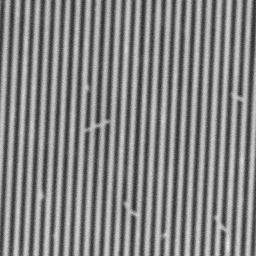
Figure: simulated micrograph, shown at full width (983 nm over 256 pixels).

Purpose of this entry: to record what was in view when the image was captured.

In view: parallel lines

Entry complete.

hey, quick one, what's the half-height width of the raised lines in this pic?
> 17.8 nm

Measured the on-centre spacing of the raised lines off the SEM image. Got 38.7 nm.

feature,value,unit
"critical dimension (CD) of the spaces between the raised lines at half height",5.63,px